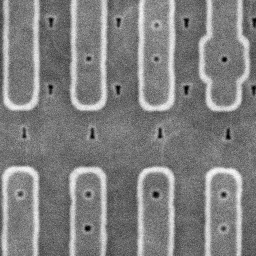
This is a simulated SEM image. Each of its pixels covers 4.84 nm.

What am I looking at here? wiring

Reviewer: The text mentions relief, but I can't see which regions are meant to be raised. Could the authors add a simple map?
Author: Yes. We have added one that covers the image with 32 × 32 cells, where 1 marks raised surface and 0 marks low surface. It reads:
01111000011110000011110000111100
01111000011110000011110000111100
01111000011110000011100000111100
01111000011110000011110000111100
01111000011110000011110000111100
01111000011110000011110001111110
01111000011110000011110001111110
01111000011110000011100001111110
01111000011110000011100001111110
01111000011110000011110001111110
01111000011110000011110000111100
01111000011110000011110000111100
01110000011110000011100000111100
00100000001100000011100000011000
00000000000000000000000000000000
00000000000000000000000000000000
00000000000000000000000000000000
00000000000000000000000000000000
00000000000000000000000000000000
00000000000000000000000000000000
00000000000000000000000000000000
01110000001110000011100000111000
01111000011110000111100000111100
11111000011110000111100000111100
11111000011110000111100000111100
01111000011110000011100000111100
01111000011110000011110000111100
01111000011110000011100000111100
01111000011110000011100000111100
11111000011110000011100000111100
11111000011110000011100000111100
11111000011110000111100000111100